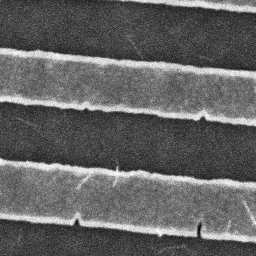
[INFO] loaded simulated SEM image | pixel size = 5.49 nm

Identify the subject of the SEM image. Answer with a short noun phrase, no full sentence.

one or a few lines or trenches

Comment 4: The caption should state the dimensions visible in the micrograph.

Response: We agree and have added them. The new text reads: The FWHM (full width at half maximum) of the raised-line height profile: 272 nm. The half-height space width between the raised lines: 0.347 um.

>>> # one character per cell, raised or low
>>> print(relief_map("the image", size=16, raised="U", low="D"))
DDDDDDDDDDDDDDDU
DDDDDDDDDDDDDDDD
DDDDDDDDDDDDDDDD
UUUUDDDDDDDDDDDD
UUUUUUUUUUUUUUDD
UUUUUUUUUUUUUUUU
DDDUUUUUUUUUUUUU
DDDDDDDDDDDDDDUU
DDDDDDDDDDDDDDDD
DDDDDDDDDDDDDDDD
UUUUDDDDDDDDDDDD
UUUUUUUUUUUUUUUD
UUUUUUUUUUUUUUUU
UUUUUUUUUUUUUUUU
DDDDDDDDDDDUUUUU
DDDDDDDDDDDDDDDD